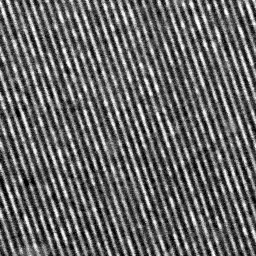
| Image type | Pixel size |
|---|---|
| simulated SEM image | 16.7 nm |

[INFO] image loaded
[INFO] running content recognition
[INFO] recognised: parallel lines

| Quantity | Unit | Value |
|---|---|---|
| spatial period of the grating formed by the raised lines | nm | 126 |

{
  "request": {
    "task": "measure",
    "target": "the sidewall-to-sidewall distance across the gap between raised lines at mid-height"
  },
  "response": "95 nm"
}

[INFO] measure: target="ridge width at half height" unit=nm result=31.7